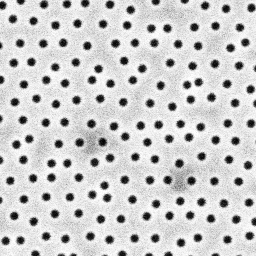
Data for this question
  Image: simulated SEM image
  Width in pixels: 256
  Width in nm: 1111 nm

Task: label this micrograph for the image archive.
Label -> a regular array of holes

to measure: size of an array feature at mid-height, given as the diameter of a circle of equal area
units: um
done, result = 0.0392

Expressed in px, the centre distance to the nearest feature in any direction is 18.9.